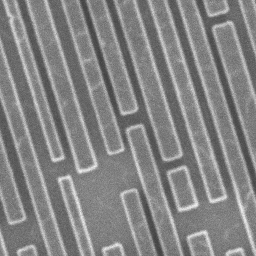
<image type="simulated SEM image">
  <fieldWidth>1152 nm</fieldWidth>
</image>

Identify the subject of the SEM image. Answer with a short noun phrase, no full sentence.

parallel lines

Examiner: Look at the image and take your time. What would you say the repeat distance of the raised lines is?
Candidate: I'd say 126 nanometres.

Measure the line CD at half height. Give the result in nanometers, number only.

76.9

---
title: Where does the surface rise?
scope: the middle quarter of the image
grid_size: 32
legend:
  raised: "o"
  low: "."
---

o...ooooo..oooo...ooooo...ooooo.
o....oooo..ooooo..ooooo....oooo.
o....oooo..ooooo..ooooo....oooo.
o....ooooo..oooo..oooooo...ooooo
oo....oooo..ooooo..ooooo...ooooo
oo....oooo..ooooo..ooooo....oooo
oo....ooooo.ooooo..oooooo...oooo
ooo....oooo..oooo...ooooo...oooo
ooo....oooo..ooooo..ooooo....ooo
ooo....ooooo.ooooo..oooooo...ooo
oooo...ooooo..oooo...ooooo...ooo
oooo....oooo..oooo...ooooo....oo
oooo....oooo.........oooooo...oo
ooooo...ooooo.........ooooo...oo
ooooo....oooo.........ooooo....o
ooooo....oooo.....oo..ooooo....o
ooooo....ooooo..oooo..oooooo...o
.ooooo....oooo..oooo...ooooo...o
.ooooo....oooo..ooooo..ooooo....
.ooooo....oooo..ooooo..oooooo...
..ooooo....oooo..oooo...ooooo...
..ooooo....oooo..ooooo..ooooo...
..ooooo..........ooooo..ooooo...
...ooooo..........oooo...ooo....
...ooooo..........ooooo.........
...ooooo..........ooooo.........
...ooo.............oooo....oooo.
...................ooooo..ooooo.
oo.................ooooo..ooooo.
oo..................oooo..oooooo
oo..................oooo...ooooo
oo...............o..ooooo..ooooo